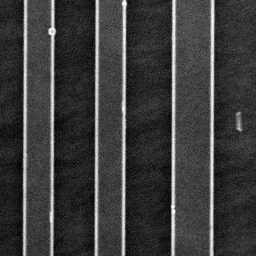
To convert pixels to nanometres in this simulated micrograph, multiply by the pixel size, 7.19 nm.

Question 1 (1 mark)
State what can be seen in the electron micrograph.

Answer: groups of lines, slits or small figures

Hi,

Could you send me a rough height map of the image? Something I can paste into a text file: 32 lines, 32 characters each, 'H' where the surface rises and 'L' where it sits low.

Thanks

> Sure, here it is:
LLLHHHHLLLLLHHHHLLLLLLHHHHHLLLLL
LLLHHHHLLLLLHHHHLLLLLLHHHHHLLLLL
LLLHHHHLLLLLHHHHLLLLLLHHHHHLLLLL
LLLHHHHLLLLLHHHHLLLLLLHHHHHLLLLL
LLLHHHHLLLLLHHHHLLLLLLHHHHHLLLLL
LLLHHHHLLLLLHHHHLLLLLLHHHHHLLLLL
LLLHHHHLLLLLHHHHLLLLLLHHHHHLLLLL
LLLHHHHLLLLLHHHHLLLLLLHHHHHLLLLL
LLLHHHHLLLLLHHHHLLLLLLHHHHHLLLLL
LLLHHHHLLLLLHHHHLLLLLLHHHHHLLLLL
LLLHHHHLLLLLHHHHLLLLLLHHHHHLLLLL
LLLHHHHLLLLLHHHHLLLLLLHHHHHLLLLL
LLLHHHHLLLLLHHHHLLLLLLHHHHHLLLLL
LLLHHHHLLLLLHHHHLLLLLLHHHHHLLLLL
LLLHHHHLLLLLHHHHLLLLLLHHHHLLLLLL
LLLHHHHLLLLLHHHHLLLLLLHHHHLLLLLL
LLLHHHHLLLLLHHHHLLLLLLHHHHLLLLLL
LLLHHHHLLLLLHHHHLLLLLLHHHHLLLLLL
LLLHHHHLLLLLHHHHLLLLLLHHHHLLLLLL
LLLHHHHLLLLLHHHHLLLLLLHHHHLLLLLL
LLLHHHHLLLLLHHHHLLLLLLHHHHLLLLLL
LLLHHHHLLLLLHHHHLLLLLLHHHHLLLLLL
LLLHHHHLLLLLHHHHLLLLLLHHHHLLLLLL
LLLHHHHLLLLLHHHHLLLLLLHHHHLLLLLL
LLLHHHHLLLLLHHHHLLLLLLHHHHLLLLLL
LLLHHHHLLLLLHHHHLLLLLHHHHHLLLLLL
LLLHHHHLLLLLHHHHLLLLLLHHHHLLLLLL
LLLHHHHLLLLLHHHLLLLLLLHHHHLLLLLL
LLLHHHHLLLLLHHHLLLLLLLHHHHLLLLLL
LLLHHHHLLLLLHHHLLLLLLLHHHHLLLLLL
LLLHHHHLLLLLHHHLLLLLLLHHHHLLLLLL
LLLHHHHLLLLLHHHLLLLLLLHHHHLLLLLL